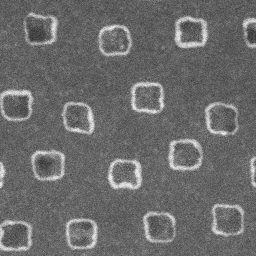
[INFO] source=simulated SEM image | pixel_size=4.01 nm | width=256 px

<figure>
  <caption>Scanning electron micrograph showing a regular array of raised bodies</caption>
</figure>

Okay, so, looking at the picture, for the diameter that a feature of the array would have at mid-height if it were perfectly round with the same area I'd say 31.6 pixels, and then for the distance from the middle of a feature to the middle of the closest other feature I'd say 0.261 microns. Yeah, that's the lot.